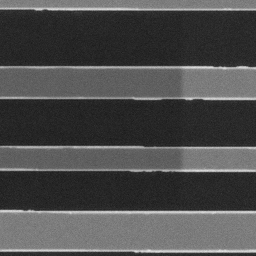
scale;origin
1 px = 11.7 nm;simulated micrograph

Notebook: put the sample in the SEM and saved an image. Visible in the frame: lines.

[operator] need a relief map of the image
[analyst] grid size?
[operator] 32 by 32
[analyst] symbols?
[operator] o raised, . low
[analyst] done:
oooooooooooooooooooooooooooooooo
................................
................................
................................
................................
................................
................................
................................
oooooooooooooooooooooooooooooooo
oooooooooooooooooooooooooooooooo
oooooooooooooooooooooooooooooooo
oooooooooooooooooooooooooooooooo
................................
................................
................................
................................
................................
................................
oooooooooooooooooooooooooooooooo
oooooooooooooooooooooooooooooooo
oooooooooooooooooooooooooooooooo
................................
................................
................................
................................
................................
oooooooooooooooooooooooooooooooo
oooooooooooooooooooooooooooooooo
oooooooooooooooooooooooooooooooo
oooooooooooooooooooooooooooooooo
oooooooooooooooooooooooooooooooo
................................